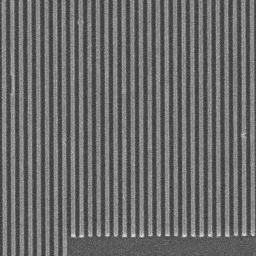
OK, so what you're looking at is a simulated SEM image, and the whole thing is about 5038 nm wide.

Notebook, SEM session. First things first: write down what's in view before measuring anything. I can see parallel lines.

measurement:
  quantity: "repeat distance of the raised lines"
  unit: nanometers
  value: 168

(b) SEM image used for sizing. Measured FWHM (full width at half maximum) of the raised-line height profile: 59 nanometres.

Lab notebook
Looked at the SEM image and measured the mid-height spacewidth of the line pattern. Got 98.4 nm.